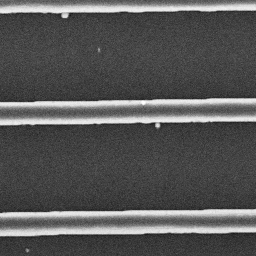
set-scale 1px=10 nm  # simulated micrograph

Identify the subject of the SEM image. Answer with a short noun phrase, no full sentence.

lines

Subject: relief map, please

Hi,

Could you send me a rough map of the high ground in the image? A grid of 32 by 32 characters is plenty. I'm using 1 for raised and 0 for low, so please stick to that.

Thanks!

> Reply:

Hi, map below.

11111111111111111111111111111111
00000000000000000000000000000000
00000000000000000000000000000000
00000000000000000000000000000000
00000000000000000000000000000000
00000000000000000000000000000000
00000000000000000000000000000000
00000000000000000000000000000000
00000000000000000000000000000000
00000000000000000000000000000000
00000000000000000000000000000000
00000000000000000000000000000000
00000000000000000000000000000000
11111111111111111111111111111111
11111111111111111111111111111111
00000000000000000000000000000000
00000000000000000000000000000000
00000000000000000000000000000000
00000000000000000000000000000000
00000000000000000000000000000000
00000000000000000000000000000000
00000000000000000000000000000000
00000000000000000000000000000000
00000000000000000000000000000000
00000000000000000000000000000000
00000000000000000000000000000000
00000000000000011111111111111111
11111111111111111111111111111111
11111111111111111111111111111111
00000000000000000000000000000000
00000000000000000000000000000000
00000000000000000000000000000000